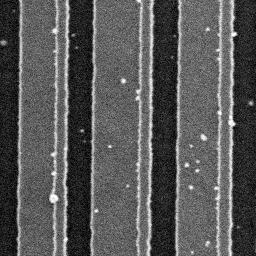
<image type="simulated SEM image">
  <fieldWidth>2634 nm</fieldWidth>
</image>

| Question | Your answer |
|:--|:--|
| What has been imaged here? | lines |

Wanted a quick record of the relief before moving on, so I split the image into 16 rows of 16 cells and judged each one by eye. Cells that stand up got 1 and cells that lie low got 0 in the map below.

0111001111011110
0111001111011110
0111001111011110
0111001110011110
0111001110011110
0111001110011110
0111001110011110
0111001110011110
0111001110011110
0111001110011100
0111001110011100
0111001110011100
0111001110011100
0111001110011100
0111001110011100
0111001110011100